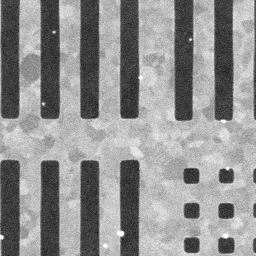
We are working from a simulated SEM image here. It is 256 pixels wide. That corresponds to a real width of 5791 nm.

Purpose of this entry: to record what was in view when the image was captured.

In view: groups of lines, slits or small figures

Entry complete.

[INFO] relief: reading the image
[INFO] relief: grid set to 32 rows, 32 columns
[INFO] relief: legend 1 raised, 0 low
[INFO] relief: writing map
00011000110001100111110011100111
00011000110001100111110011100111
00111000110001100111110011100111
00111000110001100111110011100111
00111000110001100111110011100111
00111000110001100111110011100111
00111000110001100111110011100111
00111000110001100111110011100111
00111000110001100111110011100111
00111000110001100111110011100111
00011000110011100011110011100111
00011000110011100111110011100111
00011000110011100111110011100111
00111000110011100111110011100111
00111001110011100111110011100111
11111111111111111111111111111111
11111111111111111111111111111111
11111111111111111111111111111111
11111111111111111111111111111111
11111111111111111111111111111111
00111001110011100111111111111111
00011000110011100011111001100111
00011000110001100011111001100111
00011000110001100011111111111111
00011000110001100111111111111111
00011000110001100111111001110111
00011000110001100111111001100111
00011000110001100111111111111111
00011000110001100111111111111111
00011000110001100111111111111111
00011000110001100111111001100111
00011000110001100111111001100111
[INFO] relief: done